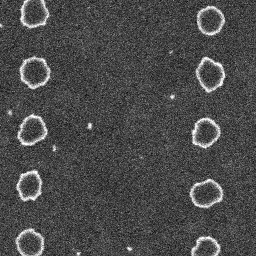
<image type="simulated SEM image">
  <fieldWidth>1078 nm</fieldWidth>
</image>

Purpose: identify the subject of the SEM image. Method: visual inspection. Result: raised bodies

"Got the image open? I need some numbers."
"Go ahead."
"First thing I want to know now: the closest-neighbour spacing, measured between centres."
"233 nanometers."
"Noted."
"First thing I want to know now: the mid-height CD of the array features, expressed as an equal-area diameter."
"119 nanometers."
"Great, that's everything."